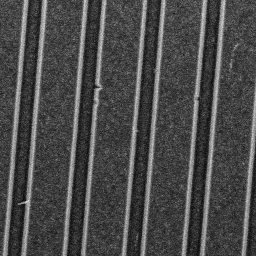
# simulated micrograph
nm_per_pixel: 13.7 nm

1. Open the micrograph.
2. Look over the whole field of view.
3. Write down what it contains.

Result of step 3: parallel lines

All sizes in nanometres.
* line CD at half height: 574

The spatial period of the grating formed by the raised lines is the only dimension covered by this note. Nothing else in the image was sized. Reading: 812 nm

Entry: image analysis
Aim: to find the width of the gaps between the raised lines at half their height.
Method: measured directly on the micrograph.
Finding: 230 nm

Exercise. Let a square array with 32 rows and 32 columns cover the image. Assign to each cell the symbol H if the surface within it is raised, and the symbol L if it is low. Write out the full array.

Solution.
HHHLLLHHHHHLLHHHHHLLHHHHHHLLHHHH
HHHLLHHHHHHLLHHHHHLLHHHHHHLLHHHH
HHHLLHHHHHHLLHHHHHLLHHHHHHLLHHHH
HHHLLHHHHHHLLHHHHHLLHHHHHLLLHHHH
HHHLLHHHHHLLLHHHHHLLHHHHHLLLHHHH
HHHLLHHHHHLLHHHHHHLLHHHHHLLHHHHH
HHHLLHHHHHLLHHHHHHLLHHHHHLLHHHHH
HHHLLHHHHHLLHHHHHHLLHHHHHLLHHHHH
HHHLLHHHHHLLHHHHHHLLHHHHHLLHHHHH
HHHLLHHHHHLLHHHHHLLLHHHHHLLHHHHH
HHLLLHHHHHLLHHHHHLLLHHHHHLLHHHHH
HHLLLHHHHHLLHHHHHLLHHHHHHLLHHHHH
HHLLLHHHHHLLHHHHHLLHHHHHHLLHHHHH
HHLLHHHHHHLLHHHHHLLHHHHHLLLHHHHH
HHLLHHHHHHLLHHHHHLLHHHHHLLLHHHHH
HHLLHHHHHHLLHHHHHLLHHHHHLLLHHHHH
HHLLHHHHHLLLHHHHHLLHHHHHLLLHHHHH
HHLLHHHHHLLHHHHHHLLHHHHHLLHHHHHH
HHLLHHHHHLLHHHHHHLLHHHHHLLHHHHHH
HHLLHHHHHLLHHHHHHLLHHHHHLLHHHHHH
HHLLHHHHHLLHHHHHHLLHHHHHLLHHHHHL
HHLLHHHHHLLHHHHHLLLHHHHHLLHHHHHL
HLLLHHHHHLLHHHHHLLLHHHHHLLHHHHHL
HLLLHHHHHLLHHHHHLLHHHHHHLLHHHHHL
HLLLHHHHHLLHHHHHLLHHHHHHLLHHHHHL
HLLHHHHHHLLHHHHHLLHHHHHHLLHHHHHL
HLLHHHHHHLLHHHHHLLHHHHHHLLHHHHHL
HLLHHHHHHLLHHHHHLLHHHHHLLLHHHHHL
HLLHHHHHLLLHHHHHLLHHHHHLLLHHHHHL
HLLHHHHHLLHHHHHHLLHHHHHLLHHHHHHL
HLLHHHHHLLHHHHHHLLHHHHHLLHHHHHHL
HLLHHHHHLLHHHHHHLLHHHHHLLHHHHHHL